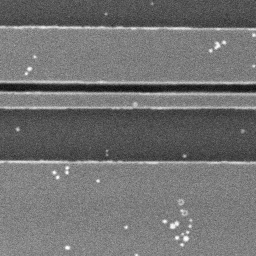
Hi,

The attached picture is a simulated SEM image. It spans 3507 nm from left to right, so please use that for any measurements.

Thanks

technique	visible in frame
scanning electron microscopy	lines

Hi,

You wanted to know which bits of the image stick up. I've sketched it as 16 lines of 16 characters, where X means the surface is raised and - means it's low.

----------------
----------------
XXXXXXXXXXXXXXXX
XXXXXXXXXXXXXXXX
XXXXXXXXXXXXXXXX
XXXXXXXXXXXXXXXX
XXXXXXXXXXXXXXXX
----------------
----------------
----------------
XXXXXXXXXXXXXXXX
XXXXXXXXXXXXXXXX
XXXXXXXXXXXXXXXX
XXXXXXXXXXXXXXXX
XXXXXXXXXXXXXXXX
XXXXXXXXXXXXXXXX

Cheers